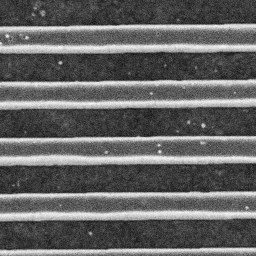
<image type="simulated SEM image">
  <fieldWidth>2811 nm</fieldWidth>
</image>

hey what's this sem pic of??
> lines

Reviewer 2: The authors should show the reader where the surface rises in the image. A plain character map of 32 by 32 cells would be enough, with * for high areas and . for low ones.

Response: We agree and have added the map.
................................
................................
................................
********************************
********************************
********************************
................................
................................
................................
................................
********************************
********************************
********************************
................................
................................
................................
................................
********************************
********************************
********************************
................................
................................
................................
................................
********************************
********************************
********************************
................................
................................
................................
................................
********************************